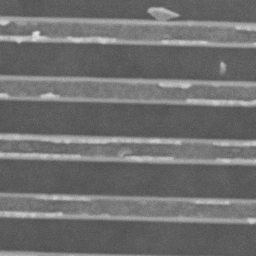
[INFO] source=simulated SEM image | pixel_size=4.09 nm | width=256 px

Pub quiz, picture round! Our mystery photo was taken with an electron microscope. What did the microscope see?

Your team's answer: parallel lines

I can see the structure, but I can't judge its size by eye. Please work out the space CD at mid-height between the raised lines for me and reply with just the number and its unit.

151 nanometres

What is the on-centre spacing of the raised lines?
58.7 px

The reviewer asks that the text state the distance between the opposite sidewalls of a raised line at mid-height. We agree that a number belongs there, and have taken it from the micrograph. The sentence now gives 88.5 nm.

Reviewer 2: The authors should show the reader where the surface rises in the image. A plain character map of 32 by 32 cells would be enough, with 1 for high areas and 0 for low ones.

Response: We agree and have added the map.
00000000000000000000000000000000
00000000000000000000000000000000
11111111000000000000000000000000
11111111111111111111111111111111
11111111111111111111111111111111
00000000000000000000001011111111
00000000000000000000000000000000
00000000000000000000000000000000
00000000000000000000000000000000
00000000000000000000000000000000
11111111111111111111111111111110
11111111111111111111111111111111
00000000111111111111111111111111
00000000000000000000000000000000
00000000000000000000000000000000
00000000000000000000000000000000
00000000000000000000000000000000
11111111111111111111000000000000
11111111111111111111111111111111
11111111111111111111111111111111
00000000000000000000000000000000
00000000000000000000000000000000
00000000000000000000000000000000
00000000000000000000000000000000
11111111000000000000000000000000
11111111111111111111111111111111
11111111111111111111111111111111
00000000000000000000000111111111
00000000000000000000000000000000
00000000000000000000000000000000
00000000000000000000000000000000
00000000000000000000000000000000